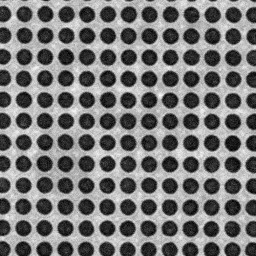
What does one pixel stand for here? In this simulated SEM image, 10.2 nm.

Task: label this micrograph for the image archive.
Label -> a regular array of holes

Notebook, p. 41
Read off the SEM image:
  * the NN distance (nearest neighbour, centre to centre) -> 0.213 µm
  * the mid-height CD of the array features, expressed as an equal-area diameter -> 177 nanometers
